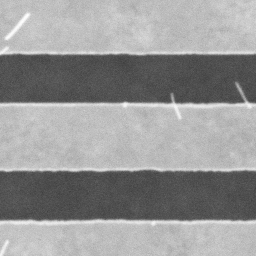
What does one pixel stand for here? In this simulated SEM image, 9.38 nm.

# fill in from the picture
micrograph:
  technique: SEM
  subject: lines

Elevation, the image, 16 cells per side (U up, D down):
UUUUUUUUUUUUUUUU
UUUUUUUUUUUUUUUU
UUUUUUUUUUUUUUUU
DDDDDDDDDDDDDDDD
DDDDDDDDDDDDDDDD
DDDDDDDDDDDDDDDD
DDDDUUUUUDDDDDDU
UUUUUUUUUUUUUUUU
UUUUUUUUUUUUUUUU
UUUUUUUUUUUUUUUU
UUUUUUUUUUUUUUUU
DDDDDDDDDDDDDDDD
DDDDDDDDDDDDDDDD
DDDDDDDDDDDDDDDD
UUUUUUUUUUUUUUUU
UUUUUUUUUUUUUUUU